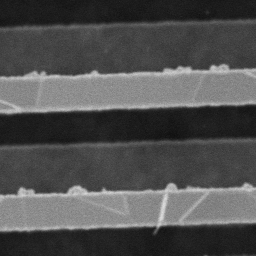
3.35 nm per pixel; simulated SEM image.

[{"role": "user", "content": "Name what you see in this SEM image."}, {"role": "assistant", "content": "lines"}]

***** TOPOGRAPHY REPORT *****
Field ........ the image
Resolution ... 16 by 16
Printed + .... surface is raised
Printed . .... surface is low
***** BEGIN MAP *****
................
........++++++++
++++++++++++++++
++++++++++++++++
++++++++++++++++
++++++++++++++++
++++++++++++++++
................
................
++++++++++++++++
++++++++++++++++
++++++++++++++++
++++++++++++++++
++++++++++++++++
................
................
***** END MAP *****